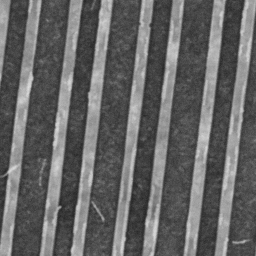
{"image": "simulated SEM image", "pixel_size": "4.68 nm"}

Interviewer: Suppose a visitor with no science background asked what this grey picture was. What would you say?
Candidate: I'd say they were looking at parallel lines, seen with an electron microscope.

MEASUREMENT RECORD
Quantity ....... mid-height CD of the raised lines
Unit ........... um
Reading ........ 0.0505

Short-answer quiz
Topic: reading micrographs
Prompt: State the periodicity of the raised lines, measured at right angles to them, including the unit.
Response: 167 nm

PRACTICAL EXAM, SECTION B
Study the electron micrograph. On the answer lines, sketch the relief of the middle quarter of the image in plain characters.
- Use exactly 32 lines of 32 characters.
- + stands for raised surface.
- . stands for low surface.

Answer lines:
++.....+++........++......++....
++.....+++........++.....+++....
++.....+++.......+++.....+++....
++.....+++.......+++.....+++....
++.....+++.......+++.....++.....
++.....+++.......+++.....++.....
++.....++........+++.....++.....
+.....+++........+++.....++.....
+.....+++........+++....+++.....
+.....+++........++......++.....
+.....+++........++.....+++.....
+.....+++.......+++.....+++.....
+.....+++........++.....++......
+.....+++.......+++.....++......
+.....++........+++.....++......
......++........++......++......
......++........++.....+++......
......++........++.....+++......
.....+++........++.....+++......
.....+++........++.....+++......
.....+++........++.....+++......
.....+++.......+++.....++.......
.....+++.......+++.....++.......
.....++........+++.....++.......
.....++........++......++.......
.....++........++......++.......
....+++........++......++.......
....+++........++.....+++.......
....+++........++.....+++.......
....+++.......+++.....++........
....+++.......+++.....+++.......
....++........+++.....++........